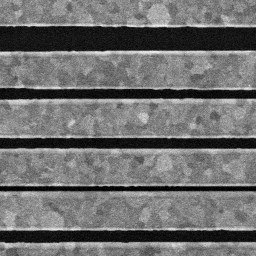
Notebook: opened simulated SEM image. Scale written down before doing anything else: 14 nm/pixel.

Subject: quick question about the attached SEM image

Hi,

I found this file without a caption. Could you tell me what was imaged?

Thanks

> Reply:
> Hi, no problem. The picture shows lines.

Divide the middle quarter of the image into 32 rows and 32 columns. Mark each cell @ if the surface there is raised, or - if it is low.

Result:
@@@@@@@@@@@@@@@@@@@@@@@@@@@@@@@@
@@@@@@@@@@@@@@@@@@@@@@@@@@@@@@@@
@@@@@@@@@@@@@@@@@@@@@@@@@@@@@@@@
@@@@@@@@@@@@@@@@@@@@@@@@@@@@@@@@
@@@@@@@@@@@@@@@@@@@@@@@@@@@@@@@@
@@@@@@@@@@@@@@@@@@@@@@@@@@@@@@@@
--------------------------------
--------------------------------
--------------------------------
@@@@@@@@@@@@@@@@@@@@@@@@@@@@@@@@
@@@@@@@@@@@@@@@@@@@@@@@@@@@@@@@@
@@@@@@@@@@@@@@@@@@@@@@@@@@@@@@@@
@@@@@@@@@@@@@@@@@@@@@@@@@@@@@@@@
@@@@@@@@@@@@@@@@@@@@@@@@@@@@@@@@
@@@@@@@@@@@@@@@@@@@@@@@@@@@@@@@@
@@@@@@@@@@@@@@@@@@@@@@@@@@@@@@@@
@@@@@@@@@@@@@@@@@@@@@@@@@@@@@@@@
@@@@@@@@@@@@@@@@@@@@@@@@@@@@@@@@
--------------------------------
--------------------------------
--------------------------------
--------------------------------
@@@@@@@@@@@@@@@@@@@@@@@@@@@@@@@@
@@@@@@@@@@@@@@@@@@@@@@@@@@@@@@@@
@@@@@@@@@@@@@@@@@@@@@@@@@@@@@@@@
@@@@@@@@@@@@@@@@@@@@@@@@@@@@@@@@
@@@@@@@@@@@@@@@@@@@@@@@@@@@@@@@@
@@@@@@@@@@@@@@@@@@@@@@@@@@@@@@@@
@@@@@@@@@@@@@@@@@@@@@@@@@@@@@@@@
@@@@@@@@@@@@@@@@@@@@@@@@@@@@@@@@
--------------------------------
--------------------------------